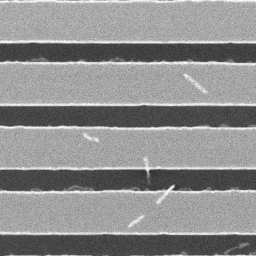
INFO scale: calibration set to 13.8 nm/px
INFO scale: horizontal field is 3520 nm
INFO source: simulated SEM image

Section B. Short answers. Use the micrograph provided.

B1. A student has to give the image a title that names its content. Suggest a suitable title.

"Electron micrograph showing lines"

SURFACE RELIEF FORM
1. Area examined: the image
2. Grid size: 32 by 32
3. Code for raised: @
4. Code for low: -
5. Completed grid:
@@@@@@@@@@@@@@@@@@@@@@@@@@@@@@@@
@@@@@@@@@@@@@@@@@@@@@@@@@@@@@@@@
@@@@@@@@@@@@@@@@@@@@@@@@@@@@@@@@
@@@@@@@@@@@@@@@@@@@@@@@@@@@@@@@@
@@@@@@@@@@@@@@@@@@@@@@@@@@@@@@@@
--------------------------------
--------------------------------
--------------------------------
@@@@@@@@@@@@@@@@@@@@@@@@@@@@@@@@
@@@@@@@@@@@@@@@@@@@@@@@@@@@@@@@@
@@@@@@@@@@@@@@@@@@@@@@@@@@@@@@@@
@@@@@@@@@@@@@@@@@@@@@@@@@@@@@@@@
@@@@@@@@@@@@@@@@@@@@@@@@@@@@@@@@
--------------------------------
--------------------------------
--------------------------------
@@@@@@@@@@@@@@@@@@@@@@@@@@@@@@@@
@@@@@@@@@@@@@@@@@@@@@@@@@@@@@@@@
@@@@@@@@@@@@@@@@@@@@@@@@@@@@@@@@
@@@@@@@@@@@@@@@@@@@@@@@@@@@@@@@@
@@@@@@@@@@@@@@@@@@@@@@@@@@@@@@@@
--------------------------------
--------------------------------
--------------------------------
@@@@@@@@@@@@@@@@@@@@@@@@@@@@@@@@
@@@@@@@@@@@@@@@@@@@@@@@@@@@@@@@@
@@@@@@@@@@@@@@@@@@@@@@@@@@@@@@@@
@@@@@@@@@@@@@@@@@@@@@@@@@@@@@@@@
@@@@@@@@@@@@@@@@@@@@@@@@@@@@@@@@
--------------------------------
--------------------------------
--------------------------------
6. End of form